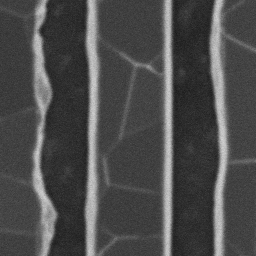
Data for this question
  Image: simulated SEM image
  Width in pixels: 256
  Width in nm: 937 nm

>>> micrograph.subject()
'one or a few lines or trenches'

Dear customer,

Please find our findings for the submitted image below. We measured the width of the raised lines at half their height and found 77.3 px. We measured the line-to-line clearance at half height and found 0.185 um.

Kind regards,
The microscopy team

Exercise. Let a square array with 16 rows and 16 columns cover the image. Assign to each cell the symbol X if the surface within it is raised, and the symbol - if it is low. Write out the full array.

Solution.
XXX---XXXX----XX
XX----XXXX----XX
XX----XXXXX--XXX
XX----XXXXX--XXX
XXX---XXXXX---XX
XXX---XXXXX---XX
XXX---XXXXX---XX
XXX---XXXXX---XX
XXX---XXXXX---XX
XX----XXXXX---XX
XX----XXXX----XX
XX----XXXX----XX
XXX---XXXX----XX
XXX---XXXX----XX
XXX---XXXX----XX
XXX---XXXX----XX